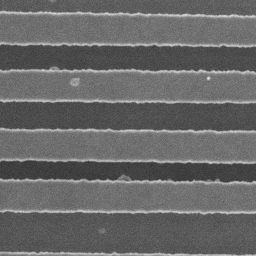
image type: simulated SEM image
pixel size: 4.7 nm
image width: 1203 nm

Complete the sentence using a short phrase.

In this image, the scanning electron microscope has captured lines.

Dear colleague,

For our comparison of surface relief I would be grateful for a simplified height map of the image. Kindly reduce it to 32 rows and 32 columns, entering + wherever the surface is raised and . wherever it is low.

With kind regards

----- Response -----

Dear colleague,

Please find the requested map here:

................................
+...............................
++++++++++++++++++++++++++++++++
++++++++++++++++++++++++++++++++
++++++++++++++++++++++++++++++++
++++++++++++++++++++++++++++++++
................................
................................
................................
++++++++++++++++++++++++++++++++
++++++++++++++++++++++++++++++++
++++++++++++++++++++++++++++++++
++++++++++++++++++++++++++++++++
................................
................................
................................
++++++++++++++++++++++++++++++++
++++++++++++++++++++++++++++++++
++++++++++++++++++++++++++++++++
++++++++++++++++++++++++++++++++
................................
................................
+++++++++.+.++..................
++++++++++++++++++++++++++++++++
++++++++++++++++++++++++++++++++
++++++++++++++++++++++++++++++++
..++++++++++++++++++++++++++++++
................................
................................
................................
................................
................................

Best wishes